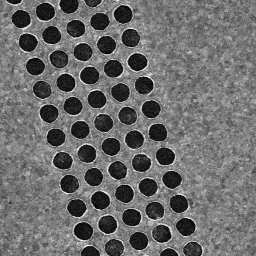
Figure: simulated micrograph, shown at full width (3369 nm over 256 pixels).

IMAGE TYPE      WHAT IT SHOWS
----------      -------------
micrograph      a regular array of holes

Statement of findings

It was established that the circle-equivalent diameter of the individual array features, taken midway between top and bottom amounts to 251 nanometers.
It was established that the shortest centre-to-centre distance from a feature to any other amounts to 321 nm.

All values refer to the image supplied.